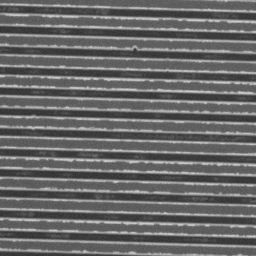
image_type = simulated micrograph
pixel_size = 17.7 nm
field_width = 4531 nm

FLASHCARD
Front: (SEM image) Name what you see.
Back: parallel lines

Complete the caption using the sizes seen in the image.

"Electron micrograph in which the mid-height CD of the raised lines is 0.21 µm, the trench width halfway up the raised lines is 148 nanometres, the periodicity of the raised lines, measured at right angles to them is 362 nm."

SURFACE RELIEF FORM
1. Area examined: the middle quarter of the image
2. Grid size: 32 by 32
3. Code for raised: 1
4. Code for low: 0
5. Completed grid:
11111111111111111111111111111111
00000000000000000011111111111111
00000000000000000000000000000000
11111000000000000000000000000000
11111111111111111111111111111111
11111111111111111111111111111111
00000000000000011111111111111111
00000000000000000000000000000000
11100000000000000000000000000000
11111111111111111111111111111111
11111111111111111111111111111111
00000000000001111111111111111111
00000000000000000000000000000000
10000000000000000000000000000000
11111111111111111111111111111111
11111111111111111111111111111111
00000000000111111111111111111111
00000000000000000000000000000000
00000000000000000000000000000000
11111111111111111111111111111111
11111111111111111111111111111111
00111111111111111111111111111111
00000000000000000000000000000000
00000000000000000000000000000000
11111111111111111111111100000000
11111111111111111111111111111111
11111111111111111111111111111111
00000000000000000000000000000000
00000000000000000000000000000000
11111111111111111111111000000000
11111111111111111111111111111111
11111111111111111111111111111111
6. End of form